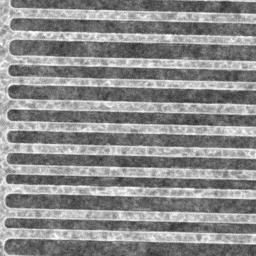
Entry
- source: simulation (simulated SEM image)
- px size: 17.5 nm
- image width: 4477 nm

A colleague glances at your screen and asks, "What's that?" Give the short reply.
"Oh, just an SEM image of parallel lines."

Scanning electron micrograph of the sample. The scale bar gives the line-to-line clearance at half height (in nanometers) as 238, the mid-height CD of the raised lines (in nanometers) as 142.